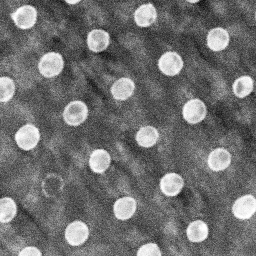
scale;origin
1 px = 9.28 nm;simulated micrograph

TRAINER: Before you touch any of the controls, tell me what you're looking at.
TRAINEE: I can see a regular array of raised bodies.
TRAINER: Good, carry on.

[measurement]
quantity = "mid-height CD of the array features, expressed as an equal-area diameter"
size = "198 nanometers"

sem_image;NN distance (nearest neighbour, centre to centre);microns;0.493